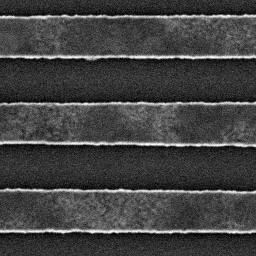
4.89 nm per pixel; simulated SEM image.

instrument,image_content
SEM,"lines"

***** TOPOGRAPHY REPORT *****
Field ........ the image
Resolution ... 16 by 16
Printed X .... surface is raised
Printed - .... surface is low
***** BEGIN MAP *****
----------------
XXXXXXXXXXXXXXXX
XXXXXXXXXXXXXXXX
XXXXXXXXXXXXXXXX
----------------
----------------
XXXXXXXXXXXXXXXX
XXXXXXXXXXXXXXXX
XXXXXXXXXXXXXXXX
----------------
----------------
----------------
XXXXXXXXXXXXXXXX
XXXXXXXXXXXXXXXX
---------XXX--XX
----------------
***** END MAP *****